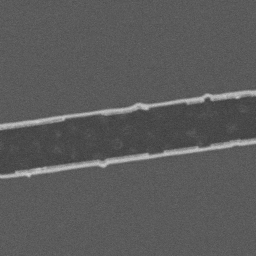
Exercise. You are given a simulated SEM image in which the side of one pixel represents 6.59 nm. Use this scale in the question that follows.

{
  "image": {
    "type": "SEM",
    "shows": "one or a few lines or trenches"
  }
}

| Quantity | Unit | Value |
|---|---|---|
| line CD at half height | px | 51.8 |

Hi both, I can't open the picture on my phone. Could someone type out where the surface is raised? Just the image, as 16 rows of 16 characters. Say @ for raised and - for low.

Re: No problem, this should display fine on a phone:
----------------
----------------
----------------
----------------
----------------
----------------
----------@@@@@@
---@@@@@@@@@@@@@
@@@@@@@@@@@@@@@@
@@@@@@@@@@@@----
@@@@------------
----------------
----------------
----------------
----------------
----------------